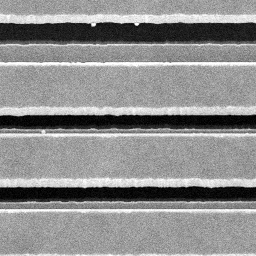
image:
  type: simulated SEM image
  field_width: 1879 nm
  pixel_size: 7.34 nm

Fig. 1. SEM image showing lines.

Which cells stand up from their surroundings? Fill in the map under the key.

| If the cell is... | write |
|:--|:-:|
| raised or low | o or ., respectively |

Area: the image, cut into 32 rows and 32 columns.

oooooooooooooooooooooooooooooooo
oooooooooooooooooooooooooooooooo
oooooooooooooooooooooooooooooooo
................................
................................
.........o..........o.....o.....
oooooooooooooooooooooooooooooooo
oooooooooooooooooooooooooooooooo
oooooooooooooooooooooooooooooooo
oooooooooooooooooooooooooooooooo
oooooooooooooooooooooooooooooooo
oooooooooooooooooooooooooooooooo
oooooooooooooooooooooooooooooooo
oooooooooooooooooooooooooooooooo
................................
................................
oooooooooooooooooooooooooooooooo
oooooooooooooooooooooooooooooooo
oooooooooooooooooooooooooooooooo
oooooooooooooooooooooooooooooooo
oooooooooooooooooooooooooooooooo
oooooooooooooooooooooooooooooooo
oooooooooooooooooooooooooooooooo
................................
................................
oooooooooooooooooooooooooooooooo
oooooooooooooooooooooooooooooooo
oooooooooooooooooooooooooooooooo
oooooooooooooooooooooooooooooooo
oooooooooooooooooooooooooooooooo
oooooooooooooooooooooooooooooooo
oooooooooooooooooooooooooooooooo